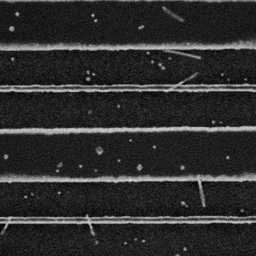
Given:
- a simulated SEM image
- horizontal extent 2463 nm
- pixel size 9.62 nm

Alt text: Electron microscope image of lines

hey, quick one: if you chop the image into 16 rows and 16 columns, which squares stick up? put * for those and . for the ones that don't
****************
****************
****************
................
................
................
................
................
****************
****************
****************
................
................
................
................
................